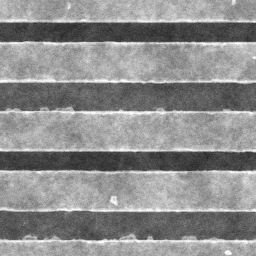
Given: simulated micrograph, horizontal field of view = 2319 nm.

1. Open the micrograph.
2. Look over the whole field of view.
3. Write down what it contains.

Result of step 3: lines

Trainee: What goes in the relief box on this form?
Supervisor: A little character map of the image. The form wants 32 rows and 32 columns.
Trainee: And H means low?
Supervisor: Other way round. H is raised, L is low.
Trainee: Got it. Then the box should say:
HHHHHHHHHHHHHHHHHHHHHHHHHHHHHHHH
HHHHHHHHHHHHHHHHHHHHHHHHHHHHHHHH
HHHHHHHHHHHHHHHHHHHHHHHHHHHHHHHH
LLLLLLLLLLLLLLLLLLLLLLLLLLLLLLLL
LLLLLLLLLLLLLLLLLLLLLLLLLLLLLLLL
HHHHHHHHHHHHHHHHHHHHHHHHHHHHHHHH
HHHHHHHHHHHHHHHHHHHHHHHHHHHHHHHH
HHHHHHHHHHHHHHHHHHHHHHHHHHHHHHHH
HHHHHHHHHHHHHHHHHHHHHHHHHHHHHHHH
HHHHHHHHHHHHHHHHHHHHHHHHHHHHHHHH
LLLLLLLLLLLLLLLLLLLLLLLLLLLLLLLL
LLLLLLLLLLLLLLLLLLLLLLLLLLLLLLLL
LLLLLLLLLLLLLLLLLLLLLLLLLLLLLLLL
LLLLLLLLLLLLLLLLLLLLLLLLLLLLLLLL
HHHHHHHHHHHHHHHHHHHHHHHHHHHHHHHH
HHHHHHHHHHHHHHHHHHHHHHHHHHHHHHHH
HHHHHHHHHHHHHHHHHHHHHHHHHHHHHHHH
HHHHHHHHHHHHHHHHHHHHHHHHHHHHHHHH
HHHHHHHHHHHHHHHHHHHHHHHHHHHHHHHH
LLLLLLLLLLLLLLLLLLLLLLLLLLLLLLLL
LLLLLLLLLLLLLLLLLLLLLLLLLLLLLLLL
HHHHHHHHHHHHHHHHHHHHHHHHHHHHHHHH
HHHHHHHHHHHHHHHHHHHHHHHHHHHHHHHH
HHHHHHHHHHHHHHHHHHHHHHHHHHHHHHHH
HHHHHHHHHHHHHHHHHHHHHHHHHHHHHHHH
HHHHHHHHHHHHHHHHHHHHHHHHHHHHHHHH
LLLLLLLLLLLLLLLLLLLLLLLLLLLLLLLL
LLLLLLLLLLLLLLLLLLLLLLLLLLLLLLLL
LLLLLLLLLLLLLLLLLLLLLLLLLLLLLLLL
LLLLLLLLLLLLLLLLLLLLLLLLLLLLLLLL
HHHHHHHHHHHHHHHHHHHHHHHHHHHHHHHH
HHHHHHHHHHHHHHHHHHHHHHHHHHHHHHHH